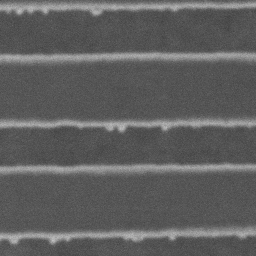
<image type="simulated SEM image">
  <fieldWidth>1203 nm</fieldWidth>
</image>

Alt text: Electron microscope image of lines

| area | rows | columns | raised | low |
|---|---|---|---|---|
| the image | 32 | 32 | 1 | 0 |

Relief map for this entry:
11111111111111111111111111111111
00000000000000000000000000000000
00000000000000000000000000000000
00000000000000000000000000000000
00000000000000000000000000000000
00000000000000000000000000000000
00000000000000000000000000000000
11111111111111111111111111111111
11111111111111111111111111111111
11111111111111111111111111111111
11111111111111111111111111111111
11111111111111111111111111111111
11111111111111111111111111111111
11111111111111111111111111111111
11111111111111111111111111111111
11111111111111111111111100111011
00000000000000000000000000000000
00000000000000000000000000000000
00000000000000000000000000000000
00000000000000000000000000000000
00000000000000000000000000000000
11111111111111111111111111111111
11111111111111111111111111111111
11111111111111111111111111111111
11111111111111111111111111111111
11111111111111111111111111111111
11111111111111111111111111111111
11111111111111111111111111111111
11111111111111111111111111111111
11111111111110000000000000000000
00000000000000000000000000000000
00000000000000000000000000000000